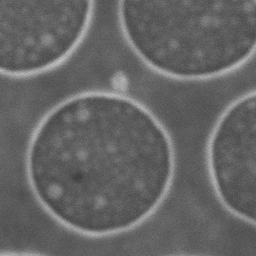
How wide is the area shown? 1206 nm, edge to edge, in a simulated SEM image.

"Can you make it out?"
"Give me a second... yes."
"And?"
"holes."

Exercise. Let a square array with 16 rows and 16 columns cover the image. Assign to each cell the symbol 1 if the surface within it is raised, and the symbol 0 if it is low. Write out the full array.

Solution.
0000001100000000
0000011100000000
0000011100000000
0000111110000001
1011111111000011
1111111111111111
1111000011111110
1110000001111100
1100000000111000
1100000000011000
1100000000011000
1100000000111100
1110000000111100
1111000001111110
1111111111111111
1111111111111111